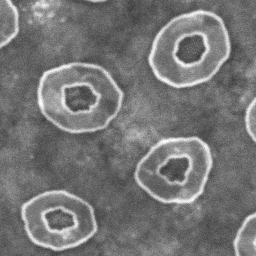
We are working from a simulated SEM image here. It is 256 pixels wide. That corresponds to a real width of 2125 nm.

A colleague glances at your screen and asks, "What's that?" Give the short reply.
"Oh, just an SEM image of ring-shaped raised bodies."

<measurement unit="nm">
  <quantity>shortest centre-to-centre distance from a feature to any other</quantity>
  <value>1000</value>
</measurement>